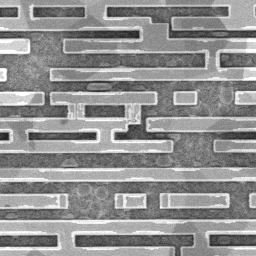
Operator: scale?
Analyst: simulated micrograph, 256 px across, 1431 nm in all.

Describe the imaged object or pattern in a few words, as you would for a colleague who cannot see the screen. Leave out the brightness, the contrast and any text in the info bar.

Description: parallel lines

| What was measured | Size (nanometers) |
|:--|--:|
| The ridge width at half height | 71.3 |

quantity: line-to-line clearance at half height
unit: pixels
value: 13.5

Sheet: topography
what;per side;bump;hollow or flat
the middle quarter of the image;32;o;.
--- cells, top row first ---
................................
oooooooooooooooooooooooooooooooo
oooooooooooooooooooooooooooooooo
oooooooooooooooooooooooooooooooo
................................
........o.......................
................................
ooooooooooooooooooooooo.....oooo
ooooooooooooooooooooooo.....oooo
ooooooooooooooooooooooo.....oooo
.oooo..........oooo.............
.oooo..........oooo.............
.oooo...........ooo.............
.oooo..........oooo.............
ooooooooooooooooooo..ooooooooooo
oooooooooooooooo.....ooooooooooo
oooooooooooooooo.....ooooooooooo
........oooo....................
.........ooo....................
ooooooooooooooooooooooooooo.....
ooooooooooooooooooooooooooo.....
ooooooooooooooooooooooooooo.....
................................
................................
................................
................................
oooooooooooooooooooooooooooooooo
oooooooooooooooooooooooooooooooo
oooooooooooooooooooooooooooooooo
................................
................................
................................